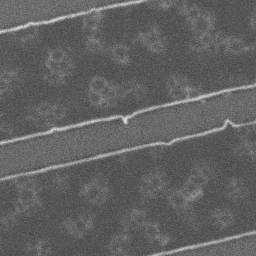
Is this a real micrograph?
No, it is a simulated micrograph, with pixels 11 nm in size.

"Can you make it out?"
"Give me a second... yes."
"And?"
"one or a few lines or trenches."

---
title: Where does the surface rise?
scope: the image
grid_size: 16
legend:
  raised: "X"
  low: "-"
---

------XXXXXXXXXX
--XXXXXXXXXXXXXX
XXXXXXXXXXXXXXXX
XXXXXXXXXXXXXXXX
XXXXXXXXXXXXXXXX
XXXXXXXXXXXXXXX-
XXXXXXXXXXX-----
XXXXXX----------
XX----------XXXX
-------XXXXXXXXX
---XXXXXXXXXXXXX
XXXXXXXXXXXXXXXX
XXXXXXXXXXXXXXXX
XXXXXXXXXXXXXXXX
XXXXXXXXXXXXXXXX
XXXXXXXXXXXX----